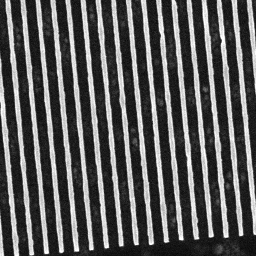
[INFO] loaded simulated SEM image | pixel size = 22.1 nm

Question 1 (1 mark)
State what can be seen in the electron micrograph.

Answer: parallel lines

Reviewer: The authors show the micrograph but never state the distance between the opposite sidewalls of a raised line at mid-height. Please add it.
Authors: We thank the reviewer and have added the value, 85.3 nm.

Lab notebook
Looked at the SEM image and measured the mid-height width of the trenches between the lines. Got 0.237 microns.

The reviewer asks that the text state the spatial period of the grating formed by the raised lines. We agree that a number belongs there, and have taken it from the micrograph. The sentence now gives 0.332 micrometres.